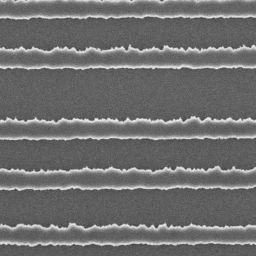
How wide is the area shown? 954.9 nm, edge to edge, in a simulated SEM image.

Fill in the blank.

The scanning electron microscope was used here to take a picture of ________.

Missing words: lines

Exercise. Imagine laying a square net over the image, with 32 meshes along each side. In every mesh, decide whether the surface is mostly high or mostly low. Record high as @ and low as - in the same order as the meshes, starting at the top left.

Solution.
@@@@@@@@@@@@@@@@@@@@@@@@@@@@@@@@
@@@@@@@@@@@@@@@@@@@@@@@@@@@@@@@@
--------------------------------
--------------------------------
--------------------------------
--------------------------------
@@@@@@@@@@@@@@@@@@@@@@@@@@@@@@@@
@@@@@@@@@@@@@@@@@@@@@@@@@@@@@@@@
@--@@-@@-@@-------------@-------
--------------------------------
--------------------------------
--------------------------------
--------------------------------
--------------------------------
--------------------------------
@@@@@@@@@@@@@@@@@@@@@@@@@@@@@@@@
@@@@@@@@@@@@@@@@@@@@@@@@@@@@@@@@
--------------------------------
--------------------------------
--------------------------------
--------------------------------
@@@@@@@@@@@@@@@@@@@@@@@@@@@@@@@@
@@@@@@@@@@@@@@@@@@@@@@@@@@@@@@@@
@@@@@@@@@-@@@@@@@-@@@@--@@@-@@--
--------------------------------
--------------------------------
--------------------------------
--------------------------------
@@@@@@@@@@@@@@@@@@@@@@@@@@@@@@@@
@@@@@@@@@@@@@@@@@@@@@@@@@@@@@@@@
-@@@@@@@@@@-@@@@--@@@@-@@----@@@
--------------------------------